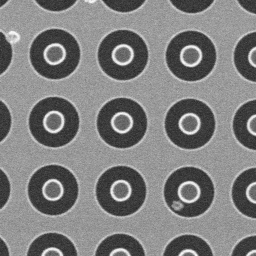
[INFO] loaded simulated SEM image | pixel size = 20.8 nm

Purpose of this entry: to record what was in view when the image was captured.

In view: an array of small figures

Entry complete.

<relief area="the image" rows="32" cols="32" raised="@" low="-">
-@@@@----@@@@-----@@@------@@@--
@@@@@@@@@@@@@@@-@@@@@@@--@@@@@@-
@@@@@@@@@@@@@@@@@@@@@@@@@@@@@@@@
@@@@@@@@@@@@@@@@@@@@@@@@@@@@@@@@
-@@@@----@@@@-----@@@@----@@@@@-
-@@@------@@------@@@------@@@--
--@@--@@--@@--@@@--@@--@@--@@--@
-@@@--@@--@@--@@---@@--@@--@@--@
-@@@------@@@-----@@@------@@---
@@@@@----@@@@@---@@@@@----@@@@--
@@@@@@@@@@@@@@@@@@@@@@@@@@@@@@@@
@@@@@@@@@@@@@@@@@@@@@@@@@@@@@@@@
@@@@@---@@@@@@---@@@@@@--@@@@@@-
-@@@-----@@@@-----@@@-----@@@@--
-@@@--@@--@@--@@--@@@--@---@@---
-@@@--@@--@@--@@--@@--@@@--@@--@
-@@@------@@---@--@@@--@---@@--@
@@@@-----@@@@-----@@@-----@@@@--
@@@@@@@@@@@@@@--@@@@@@@--@@@@@@-
@@@@@@@@@@@@@@@@@@@@@@@@@@@@@@@@
@@@@@@@@@@@@@@@@@@@@@@@@@@@@@@@@
-@@@-----@@@@----@@@@@----@@@@--
-@@@------@@------@@@-----@@@---
-@@--@@@--@@--@@--@@--@@@--@@--@
-@@---@@--@@--@@--@@--@@@--@@--@
-@@@-----@@@------@@@-----@@@---
@@@@@---@@@@@----@@@@@----@@@@--
@@@@@@@@@@@@@@@@@@@@@@@@@@@@@@@@
@@@@@@@@@@@@@@@@@@@@@@@@@@@@@@@@
@@@@@---@@@@@@--@@@@@@---@@@@@@-
-@@@-----@@@------@@@-----@@@@--
-@@---@---@@--@@--@@---@---@@--@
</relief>